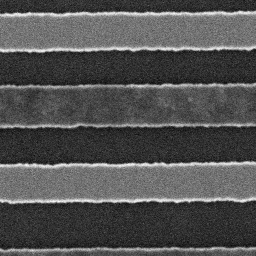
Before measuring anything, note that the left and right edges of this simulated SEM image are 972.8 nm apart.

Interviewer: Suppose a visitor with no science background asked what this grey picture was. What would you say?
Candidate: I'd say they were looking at lines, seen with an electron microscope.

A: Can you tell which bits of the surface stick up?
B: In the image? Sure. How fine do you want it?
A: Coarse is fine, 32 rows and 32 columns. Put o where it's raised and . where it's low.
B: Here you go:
................................
..........................oo.ooo
oooooooooooooooooooooooooooooooo
oooooooooooooooooooooooooooooooo
oooooooooooooooooooooooooooooooo
oooooooooooooooooooooooooooooooo
................................
................................
................................
................................
.............................o.o
oooooooooooooooooooooooooooooooo
oooooooooooooooooooooooooooooooo
oooooooooooooooooooooooooooooooo
oooooooooooooooooooooooooooooooo
oooooooooooooooooooooooooooooooo
................................
................................
................................
................................
................o..o...ooooooooo
oooooooooooooooooooooooooooooooo
oooooooooooooooooooooooooooooooo
oooooooooooooooooooooooooooooooo
oooooooooooooooooooooooooooooooo
................................
................................
................................
................................
................................
................................
oooooooooooooooooooooooooooooooo